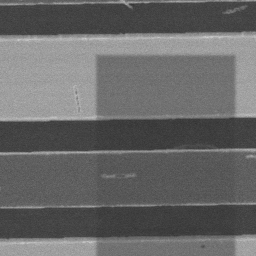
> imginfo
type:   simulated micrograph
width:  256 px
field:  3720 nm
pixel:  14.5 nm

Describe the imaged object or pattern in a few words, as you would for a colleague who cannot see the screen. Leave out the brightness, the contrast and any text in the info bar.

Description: lines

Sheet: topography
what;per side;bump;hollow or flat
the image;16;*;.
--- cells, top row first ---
................
................
****************
****************
****************
****************
****************
**..............
................
......**********
****************
****************
****************
................
................
****************